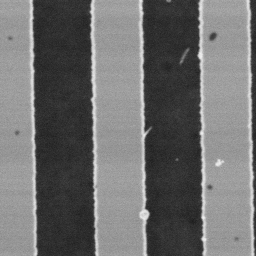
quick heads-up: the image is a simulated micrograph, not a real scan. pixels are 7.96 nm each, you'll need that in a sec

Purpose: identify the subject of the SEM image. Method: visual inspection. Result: lines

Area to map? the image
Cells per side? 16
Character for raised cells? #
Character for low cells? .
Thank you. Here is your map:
##....###...####
##....###...####
##....###....###
##....###...####
##....###....###
##....###....###
##....###....###
##....###....###
##....###....###
##....###....###
##....###....###
##....###....###
##....###....###
##....###....###
##....###....###
##....###....###